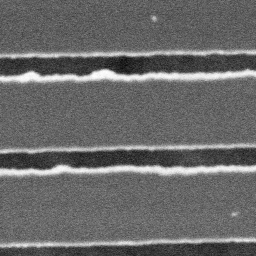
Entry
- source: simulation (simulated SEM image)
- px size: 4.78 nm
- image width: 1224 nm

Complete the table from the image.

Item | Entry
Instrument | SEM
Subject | lines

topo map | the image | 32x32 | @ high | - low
@@@@@@@@@@@@@@@@@@@@@@@@@@@@@@@@
@@@@@@@@@@@@@@@@@@@@@@@@@@@@@@@@
@@@@@@@@@@@@@@@@@@@@@@@@@@@@@@@@
@@@@@@@@@@@@@@@@@@@@@@@@@@@@@@@@
@@@@@@@@@@@@@@@@@@@@@@@@@@@@@@@@
@@@@@@@@@@@@@@@@@@@@@@@@@@@@@@@@
@@@@@@@@@@@@@@@@@@@@@@@@@@@@@@@@
--------------------------------
--------------------------------
------------@@----@@@@@@@@@@@@@@
@@@@@@@@@@@@@@@@@@@@@@@@@@@@@@@@
@@@@@@@@@@@@@@@@@@@@@@@@@@@@@@@@
@@@@@@@@@@@@@@@@@@@@@@@@@@@@@@@@
@@@@@@@@@@@@@@@@@@@@@@@@@@@@@@@@
@@@@@@@@@@@@@@@@@@@@@@@@@@@@@@@@
@@@@@@@@@@@@@@@@@@@@@@@@@@@@@@@@
@@@@@@@@@@@@@@@@@@@@@@@@@@@@@@@@
@@@@@@@@@@@@@@@@@@@@@@@@@@@@@@@@
@@@@@@@@@@@@@@@@@@@@@@@@@@------
--------------------------------
--------------------------------
@@@@@@@@@@@@@@@@@@@@@@@@@@@@@@@@
@@@@@@@@@@@@@@@@@@@@@@@@@@@@@@@@
@@@@@@@@@@@@@@@@@@@@@@@@@@@@@@@@
@@@@@@@@@@@@@@@@@@@@@@@@@@@@@@@@
@@@@@@@@@@@@@@@@@@@@@@@@@@@@@@@@
@@@@@@@@@@@@@@@@@@@@@@@@@@@@@@@@
@@@@@@@@@@@@@@@@@@@@@@@@@@@@@@@@
@@@@@@@@@@@@@@@@@@@@@@@@@@@@@@@@
@@@@@@@@@@@@@@@@@@@@@@@@@@@@@@@@
@@@@@@@@@@@@@@@@@@--------------
--------------------------------